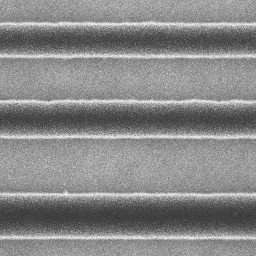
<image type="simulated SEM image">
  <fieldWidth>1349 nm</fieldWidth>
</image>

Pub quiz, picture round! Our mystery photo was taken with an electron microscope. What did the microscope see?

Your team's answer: one or a few lines or trenches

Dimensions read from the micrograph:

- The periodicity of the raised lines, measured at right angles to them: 0.465 um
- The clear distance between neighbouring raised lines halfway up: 263 nm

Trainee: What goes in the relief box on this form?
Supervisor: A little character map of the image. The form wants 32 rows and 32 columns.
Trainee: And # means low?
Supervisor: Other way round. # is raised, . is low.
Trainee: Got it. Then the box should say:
................................
................................
................................
################################
################################
################################
################################
................................
................................
................................
................................
................................
................................
################################
################################
################################
################################
................................
................................
................................
................................
................................
................................
................................
################################
################################
################################
################################
################################
################################
................................
................................